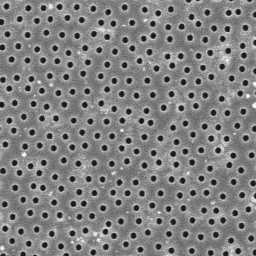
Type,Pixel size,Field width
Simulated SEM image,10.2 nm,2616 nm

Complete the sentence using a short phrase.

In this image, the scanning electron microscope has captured a regular array of holes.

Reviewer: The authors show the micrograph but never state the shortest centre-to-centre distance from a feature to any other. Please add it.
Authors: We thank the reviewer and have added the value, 0.136 microns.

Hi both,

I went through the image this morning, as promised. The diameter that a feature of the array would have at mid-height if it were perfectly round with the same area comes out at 64.2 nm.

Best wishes